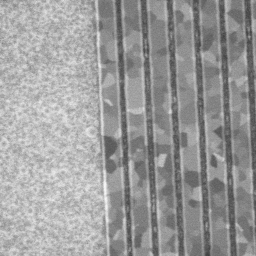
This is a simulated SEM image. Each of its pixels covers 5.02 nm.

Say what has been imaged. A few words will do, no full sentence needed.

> parallel lines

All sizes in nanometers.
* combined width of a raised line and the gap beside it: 129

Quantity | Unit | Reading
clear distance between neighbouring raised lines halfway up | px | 7.61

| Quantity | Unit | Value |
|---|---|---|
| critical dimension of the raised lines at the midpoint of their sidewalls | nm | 90.9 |